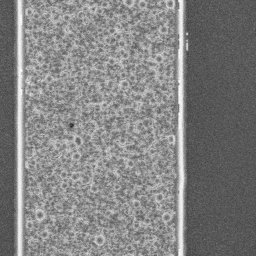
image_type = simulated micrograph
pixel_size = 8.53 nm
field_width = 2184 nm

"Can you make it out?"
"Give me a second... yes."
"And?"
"one or a few lines or trenches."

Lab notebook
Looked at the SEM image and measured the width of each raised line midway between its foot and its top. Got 162 px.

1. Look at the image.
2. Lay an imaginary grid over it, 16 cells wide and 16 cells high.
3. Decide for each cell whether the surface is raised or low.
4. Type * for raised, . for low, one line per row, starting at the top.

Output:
.**********.....
.**********.....
.**********.....
.**********.....
.**********.....
.**********.....
.**********.....
.**********.....
.**********.....
.**********.....
.**********.....
.**********.....
.**********.....
.**********.....
.**********.....
.**********.....